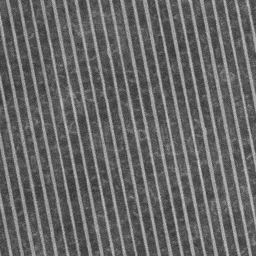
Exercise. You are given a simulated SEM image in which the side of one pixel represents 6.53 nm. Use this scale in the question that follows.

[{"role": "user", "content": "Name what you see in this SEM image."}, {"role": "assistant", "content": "parallel lines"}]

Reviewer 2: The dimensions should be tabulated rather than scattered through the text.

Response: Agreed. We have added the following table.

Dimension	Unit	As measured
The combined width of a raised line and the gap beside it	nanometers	73.2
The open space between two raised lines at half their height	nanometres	58.5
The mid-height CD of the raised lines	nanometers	14.5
